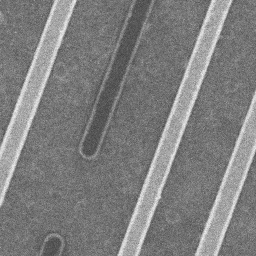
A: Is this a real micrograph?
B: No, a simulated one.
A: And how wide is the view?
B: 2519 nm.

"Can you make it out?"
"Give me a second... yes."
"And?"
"one or a few lines or trenches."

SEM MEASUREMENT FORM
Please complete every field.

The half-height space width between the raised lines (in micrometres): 0.555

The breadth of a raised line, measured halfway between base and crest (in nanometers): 173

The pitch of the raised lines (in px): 73.3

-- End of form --